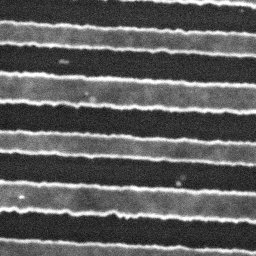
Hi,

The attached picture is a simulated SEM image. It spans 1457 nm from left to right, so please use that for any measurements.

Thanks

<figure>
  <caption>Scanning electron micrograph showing lines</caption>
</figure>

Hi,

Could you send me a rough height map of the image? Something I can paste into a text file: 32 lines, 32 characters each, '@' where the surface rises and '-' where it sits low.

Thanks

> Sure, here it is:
---------------------------@@@@@
--------------------------------
--------------------------------
@@@@@@@@@@@@@@@@@---------------
@@@@@@@@@@@@@@@@@@@@@@@@@@@@@@@@
@@@@@@@@@@@@@@@@@@@@@@@@@@@@@@@@
-------------------@-@@@@@@@@@@@
--------------------------------
--------------------------------
@@@@@@@@@@----------------------
@@@@@@@@@@@@@@@@@@@@@@@@@@@@----
@@@@@@@@@@@@@@@@@@@@@@@@@@@@@@@@
@@@@@@@@@@@@@@@@@@@@@@@@@@@@@@@@
--------------@@@@@@@@@@@@@@@@@@
--------------------------------
--------------------------------
@@@-----------------------------
@@@@@@@@@@@@@@@@@@@@@@@@--------
@@@@@@@@@@@@@@@@@@@@@@@@@@@@@@@@
----------@@@@@@@@@@@@@@@@@@@@@@
----------------------------@@@@
--------------------------------
--------------------------------
@@@@@@@@@@@@@@@@@@--------------
@@@@@@@@@@@@@@@@@@@@@@@@@@@@@@@@
@@@@@@@@@@@@@@@@@@@@@@@@@@@@@@@@
--@--@@@@@@@@@@@@@@@@@@@@@@@@@@@
-----------------------@-@@@@@@@
--------------------------------
--------------------------------
@@@@@@@@@@@@@@@-----------------
@@@@@@@@@@@@@@@@@@@@@@@@@@@@@@@-